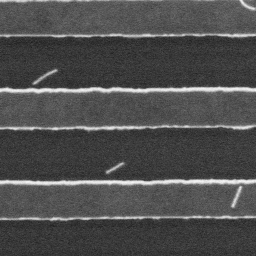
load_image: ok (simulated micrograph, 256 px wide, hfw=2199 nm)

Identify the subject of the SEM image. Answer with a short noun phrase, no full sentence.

lines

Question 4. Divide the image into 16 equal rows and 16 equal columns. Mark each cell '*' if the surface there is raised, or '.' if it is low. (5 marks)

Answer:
****************
****************
................
................
................
................
****************
****************
................
................
................
****************
****************
****************
................
................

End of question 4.